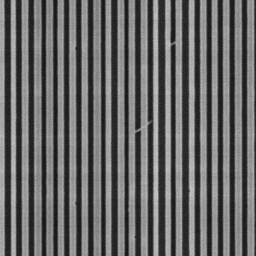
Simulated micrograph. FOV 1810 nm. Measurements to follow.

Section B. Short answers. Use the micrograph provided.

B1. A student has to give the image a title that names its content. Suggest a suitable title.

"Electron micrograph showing parallel lines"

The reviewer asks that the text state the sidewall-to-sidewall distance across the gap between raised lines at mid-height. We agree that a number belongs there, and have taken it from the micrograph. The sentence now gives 6.12 px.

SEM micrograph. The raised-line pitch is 0.0839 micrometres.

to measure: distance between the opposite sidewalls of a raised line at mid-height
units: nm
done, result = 43.3